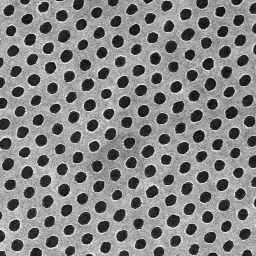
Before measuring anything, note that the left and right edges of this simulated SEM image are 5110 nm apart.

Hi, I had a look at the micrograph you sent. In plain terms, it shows a regular array of holes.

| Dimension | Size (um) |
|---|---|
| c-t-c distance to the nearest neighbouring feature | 0.395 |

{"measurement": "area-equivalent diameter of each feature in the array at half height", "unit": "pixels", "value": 11.8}